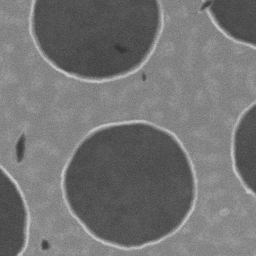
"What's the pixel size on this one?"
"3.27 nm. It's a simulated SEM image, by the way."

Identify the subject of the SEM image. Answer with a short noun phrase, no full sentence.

holes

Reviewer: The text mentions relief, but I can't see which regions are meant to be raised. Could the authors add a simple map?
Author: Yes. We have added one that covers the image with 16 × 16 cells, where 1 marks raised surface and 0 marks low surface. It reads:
1100000000111000
1100000000111100
1100000000111110
1110000001111111
1111000011111111
1111111111111111
1111111111111111
1111111111111110
1111110000011110
1111100000011110
1111000000001110
0111000000001110
0111000000001111
0011100000001111
0011110000011111
0111111111111111